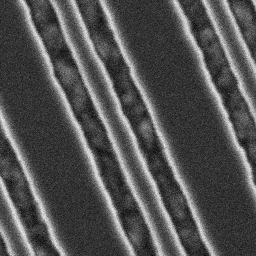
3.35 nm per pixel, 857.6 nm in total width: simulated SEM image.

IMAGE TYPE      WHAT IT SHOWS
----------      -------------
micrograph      lines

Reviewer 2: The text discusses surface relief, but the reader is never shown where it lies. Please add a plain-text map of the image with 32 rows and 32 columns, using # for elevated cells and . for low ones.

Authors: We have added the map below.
###...###....#########...###....
####...###...##########...###...
####...###....#########...###...
####....###...##########...###..
#####...###...##########...###..
#####...####...##########...###.
######...###...##########...###.
######...####...#########....##.
#######...###...##########...###
#######.#.####..##########...###
#######....###...##########...##
########...###....#########...##
########....###...##########...#
#########...###...##########...#
#########....##....##########...
##########...###...##########...
.#########...###....#########...
.##########...###...##########..
..#########...###....#########..
..##########...###...##########.
...#########...###...##########.
...#########...####...#########.
...##########...###...##########
#...#########...####...#########
#...##########...###...#########
##...#########...###....########
##...#########....###...########
##....#########...###...########
###...#########....###...#######
###...##########...###...#######
.###...#########...###....######
.###...##########...###...######